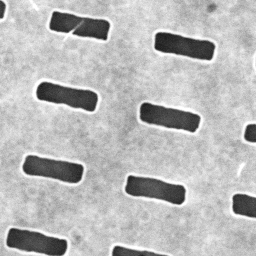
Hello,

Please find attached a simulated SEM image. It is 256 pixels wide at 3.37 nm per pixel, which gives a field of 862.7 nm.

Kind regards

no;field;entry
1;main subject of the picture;holes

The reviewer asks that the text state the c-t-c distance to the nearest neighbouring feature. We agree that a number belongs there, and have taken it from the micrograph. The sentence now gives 246 nanometres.